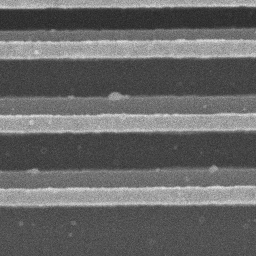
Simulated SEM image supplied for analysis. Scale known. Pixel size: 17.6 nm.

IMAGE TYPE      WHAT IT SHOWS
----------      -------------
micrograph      lines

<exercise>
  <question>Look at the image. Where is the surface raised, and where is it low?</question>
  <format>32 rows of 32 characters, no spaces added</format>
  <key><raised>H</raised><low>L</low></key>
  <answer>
HHHHHHHHHHHHHHHHHHHHHHHHHHHHHHHH
LLLLLLLLLLLLLLLLLLLLLLLLLLLLLLLL
LLLLLLLLLLLLLLLLLLLLLLLLLLLLLLLL
LLLLLLLLLLLLLLLLLLLLLLLLLLLLLLLL
HHHHHHHHHHHHHHHHHHHHHHHHHHHHHHHH
HHHHHHHHHHHHHHHHHHHHHHHHHHHHHHHH
HHHHHHHHHHHHHHHHHHHHHHHHHHHHHHHH
LLLLLLLLLLLLLLLLLLLLLLLLLLLLLLLL
LLLLLLLLLLLLLLLLLLLLLLLLLLLLLLLL
LLLLLLLLLLLLLLLLLLLLLLLLLLLLLLLL
LLLLLLLLLLLLLLLLLLLLLLLLLLLLLLLL
LLLLLLLLLLLLLLLLLLLLLLLLLLLLLLLL
HHHHHHHHHHHHHHHHHHHHHHHHHHHHHHHH
HHHHHHHHHHHHHHHHHHHHHHHHHHHHHHHH
HHHHHHHHHHHHHHHHHHHHHHHHHHHHHHHH
HHHHHHHHHHHHHHHHHHHHHHHHHHHHHHHH
HHHHHHHHHHHHHLHHLLLLLLLLLLLLLLLL
LLLLLLLLLLLLLLLLLLLLLLLLLLLLLLLL
LLLLLLLLLLLLLLLLLLLLLLLLLLLLLLLL
LLLLLLLLLLLLLLLLLLLLLLLLLLLLLLLL
LLLLLLLLLLLLLLLLLLLLLLLLLLLLLLLL
HLLHHHHHHHHHHHHHHHHHHHHHHHHHHHHH
HHHHHHHHHHHHHHHHHHHHHHHHHHHHHHHH
HHHHHHHHHHHHHHHHHHHHHHHHHHHHHHHH
HHHHHHHHHHHHHHHHHHHHHHHHHHHHHHHH
HHHHHHHHHHHHHHHHHHHHHHHHHHHHHHHH
LLLLLLLLLLLLLLLLLLLLLLLLLLLLLLLL
LLLLLLLLLLLLLLLLLLLLLLLLLLLLLLLL
LLLLLLLLLLLLLLLLLLLLLLLLLLLLLLLL
LLLLLLLLLLLLLLLLLLLLLLLLLLLLLLLL
LLLLLLLLLLLLLLLLLLLLLLLLLLLLLLLL
LLLLLLLLLLLLLLLLLLLLLLLLLLLLLLLL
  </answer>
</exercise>